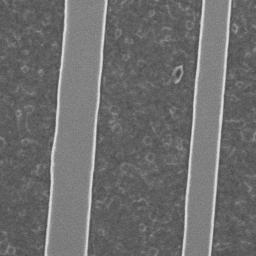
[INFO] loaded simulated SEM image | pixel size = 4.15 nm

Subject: one or a few lines or trenches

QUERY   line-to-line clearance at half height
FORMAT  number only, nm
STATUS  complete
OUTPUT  400